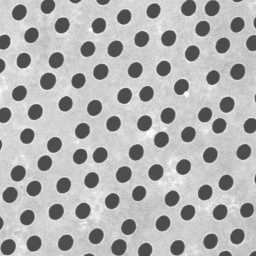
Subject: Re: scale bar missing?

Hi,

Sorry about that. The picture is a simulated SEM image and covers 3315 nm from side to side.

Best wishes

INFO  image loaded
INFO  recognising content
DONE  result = a regular array of holes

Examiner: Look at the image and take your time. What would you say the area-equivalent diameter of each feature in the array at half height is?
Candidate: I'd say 203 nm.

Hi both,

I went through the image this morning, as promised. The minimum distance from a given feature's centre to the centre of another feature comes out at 333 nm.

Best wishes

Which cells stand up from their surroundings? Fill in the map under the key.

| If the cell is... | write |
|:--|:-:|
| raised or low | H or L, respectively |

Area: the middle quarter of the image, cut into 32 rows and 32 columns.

HHHHHHHHLLLHHHHHLLLLHHHLLLLHHHHH
HHHHHHHLLLLHHHHHLLLLHHHLLLLHHHHH
HHHLLHHLLLLHHHHHLLLHHHHLLLHHHHHH
HHLLLHHHLLHHHHHHHLHHHHHHHHHHHHHH
HHLLLHHHHHHHHHHHHHHHHHHHHHHHLLLH
HHLLLHHHHHHHHHHHHHHHHHHHHHHLLLLH
HHHHHHHHHHHHHHLLLHHLLLHHHHHLLLLH
HHHHHHHHHHHHHLLLLHHLLLHHHHHHLLHH
LLHHHHHHHHHHHLLLLHHLLLHHHHHHHHHH
LLHHHHLLLHHHHHLLHHHHHHHHHHHHHHHH
LLHHHHLLLLHHHHHHHHHHHHHHHHHHHHHH
LHHHHHLLLHHHHHHHHHHHHHHHHLLLHHHH
HHHHHHLLLHHHHHHHHHHHHHHHLLLLHHHH
HHHHHHHHHHHLLLHHHHHLLLHHLLLLHHHH
HHHHHHHHHHHLLLHHHHLLLLHHHLLHHHHH
HHHLLLHHHHHLLLHHHHLLLLHHHHHHHHHH
HHHLLLLHHHHLLLHHHHHLLHHHHHHHHHLL
HHHLLLHHHHHHHHHHHHHHHHHLLLHHHLLL
HHHLLHHHHHHHHHHHHHHHHHHLLLHHHLLL
HHHHHHHHHHHHHHHHHHHHHHLLLLHHHHLL
HHHHHHHHHHHHHHHHHLLLHHHLLHHHHHHH
HHHLLHHHLLLHHHHHLLLLHHHHHHHHHHHH
HHLLLLHLLLLHHHHHLLLLHHHHHHHHHHHH
HHLLLLHLLLLHHHHHLLLHHHHHHHHHHHHH
HHHLLHHHLLHHHHHHHHHHHHHHHHHHHLLL
HHHHHHHHHHHHHHHLHHHHHHLLHHHHLLLL
HHHHHHHHHHHHHLLLLHHHHLLLLHHHLLLL
HHHHHHLLHHHHHLLLLHHHHLLLLHHHHLLH
LHHHHLLLLHHHHLLLLHHHHLLLHHHHHHHH
LLHHHLLLLHHHHHLLHHHHHHHHHHHHHHHH
LLHHHLLLHHHHHHHHHHLLHHHHHHHHHHHH
LHHHHHHHHHHHHHHHHLLLLHHHHHHHHHHH